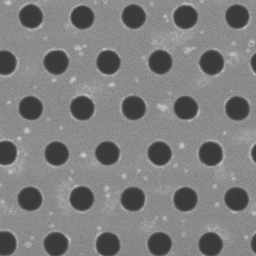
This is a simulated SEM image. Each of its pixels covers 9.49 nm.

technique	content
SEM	a regular array of holes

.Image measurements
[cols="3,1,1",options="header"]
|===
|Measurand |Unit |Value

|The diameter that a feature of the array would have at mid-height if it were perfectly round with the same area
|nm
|218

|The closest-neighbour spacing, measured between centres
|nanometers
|487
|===